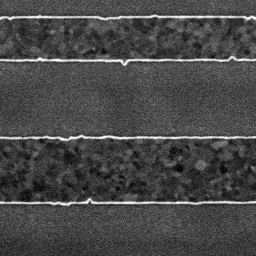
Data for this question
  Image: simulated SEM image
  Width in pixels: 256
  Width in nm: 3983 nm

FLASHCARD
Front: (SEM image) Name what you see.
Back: one or a few lines or trenches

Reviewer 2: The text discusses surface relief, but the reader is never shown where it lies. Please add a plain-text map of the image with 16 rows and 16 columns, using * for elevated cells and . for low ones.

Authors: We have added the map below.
................
****************
****************
****************
................
................
................
................
................
****************
****************
****************
****************
................
................
................